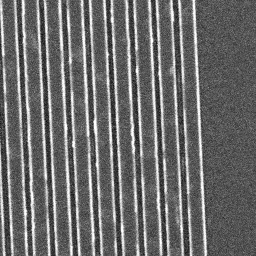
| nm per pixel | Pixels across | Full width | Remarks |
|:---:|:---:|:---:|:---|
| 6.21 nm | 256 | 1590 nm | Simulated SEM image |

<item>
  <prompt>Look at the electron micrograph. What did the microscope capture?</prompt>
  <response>parallel lines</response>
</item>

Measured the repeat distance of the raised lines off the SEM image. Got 138 nanometres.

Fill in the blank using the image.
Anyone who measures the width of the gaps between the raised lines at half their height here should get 38.8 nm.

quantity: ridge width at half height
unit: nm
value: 101